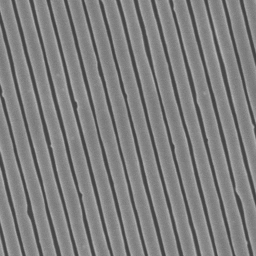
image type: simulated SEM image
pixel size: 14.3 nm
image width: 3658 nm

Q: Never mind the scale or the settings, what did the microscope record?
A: parallel lines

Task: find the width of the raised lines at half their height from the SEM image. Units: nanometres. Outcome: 184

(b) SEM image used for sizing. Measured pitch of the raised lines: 0.243 microns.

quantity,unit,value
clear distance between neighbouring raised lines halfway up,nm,55.4